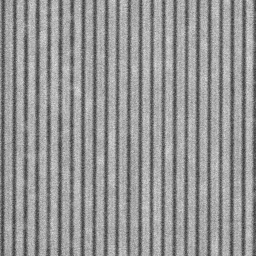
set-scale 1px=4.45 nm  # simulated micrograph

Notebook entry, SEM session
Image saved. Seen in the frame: parallel lines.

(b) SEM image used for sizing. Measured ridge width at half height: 33.9 nanometres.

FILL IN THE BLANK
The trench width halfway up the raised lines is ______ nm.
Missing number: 17.2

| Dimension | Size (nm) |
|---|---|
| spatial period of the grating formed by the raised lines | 51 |